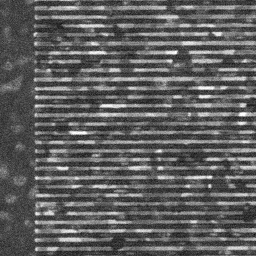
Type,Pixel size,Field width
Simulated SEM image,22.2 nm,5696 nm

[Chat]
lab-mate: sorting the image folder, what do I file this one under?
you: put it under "parallel lines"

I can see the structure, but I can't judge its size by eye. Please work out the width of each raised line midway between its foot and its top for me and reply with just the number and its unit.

0.064 micrometres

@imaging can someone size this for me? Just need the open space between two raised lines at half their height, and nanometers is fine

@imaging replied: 131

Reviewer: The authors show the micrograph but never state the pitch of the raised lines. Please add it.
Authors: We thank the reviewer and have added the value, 198 nm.